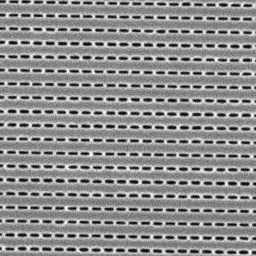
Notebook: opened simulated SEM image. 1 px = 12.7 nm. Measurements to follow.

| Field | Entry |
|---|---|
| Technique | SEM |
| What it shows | a regular array of holes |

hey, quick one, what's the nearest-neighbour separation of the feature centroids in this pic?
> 0.153 microns